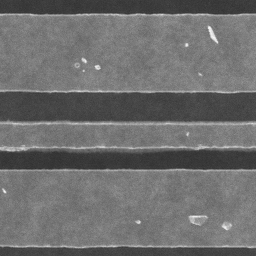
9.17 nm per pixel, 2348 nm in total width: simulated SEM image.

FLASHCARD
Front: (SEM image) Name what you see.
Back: lines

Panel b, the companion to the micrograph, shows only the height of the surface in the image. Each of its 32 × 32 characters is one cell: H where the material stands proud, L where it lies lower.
LLLLLLLLLLLLLLLLLLLLLLLLLLLLLLLL
LLLLLLLLLLLLLLLLLLLLLLLLLLLLLLLL
HHHHHHHHHHHHHHHHHHHHHHHHHHHHHHHH
HHHHHHHHHHHHHHHHHHHHHHHHHHHHHHHH
HHHHHHHHHHHHHHHHHHHHHHHHHHHHHHHH
HHHHHHHHHHHHHHHHHHHHHHHHHHHHHHHH
HHHHHHHHHHHHHHHHHHHHHHHHHHHHHHHH
HHHHHHHHHHHHHHHHHHHHHHHHHHHHHHHH
HHHHHHHHHHHHHHHHHHHHHHHHHHHHHHHH
HHHHHHHHHHHHHHHHHHHHHHHHHHHHHHHH
HHHHHHHHHHHHHHHHHHHHHHHHHHHHHHHH
LLLLLLLLLLLLLLLLLLHLLLLLLLLHHHLL
LLLLLLLLLLLLLLLLLLLLLLLLLLLLLLLL
LLLLLLLLLLLLLLLLLLLLLLLLLLLLLLLL
LLLLLLLLLLLLLLLLLLLLLLLLLLLLLLLL
HHHLHHHHHHHHHHHLLLHHHHLLLHHLLLHH
HHHHHHHHHHHHHHHHHHHHHHHHHHHHHHHH
HHHHHHHHHHHHHHHHHHHHHHHHHHHHHHHH
HHHHLHHLHHHHLHHHHHHHLLLLHHLLLLHL
LLLLLLLLLLLLLLLLLLLLLLLLLLLLLLLL
LLLLLLLLLLLLLLLLLLLLLLLLLLLLLLLL
HHHHHHHHHHHHHHHHHHHHHHHHHHHHHHHH
HHHHHHHHHHHHHHHHHHHHHHHHHHHHHHHH
HHHHHHHHHHHHHHHHHHHHHHHHHHHHHHHH
HHHHHHHHHHHHHHHHHHHHHHHHHHHHHHHH
HHHHHHHHHHHHHHHHHHHHHHHHHHHHHHHH
HHHHHHHHHHHHHHHHHHHHHHHHHHHHHHHH
HHHHHHHHHHHHHHHHHHHHHHHHHHHHHHHH
HHHHHHHHHHHHHHHHHHHHHHHHHHHHHHHH
HHHHHHHHHHHHHHHHHHHHHHHHHHHHHHHH
HHHHHHHHHHHHHHHHHHHHHHHHHHHHHHHH
LLLLLLLLLLLLLLLLLLLLLLLLLLLLLLLL